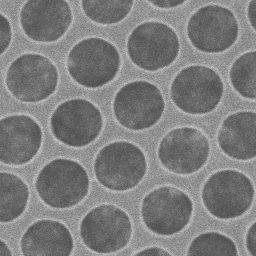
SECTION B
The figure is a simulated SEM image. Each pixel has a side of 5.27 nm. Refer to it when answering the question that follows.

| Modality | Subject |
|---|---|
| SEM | a regular array of holes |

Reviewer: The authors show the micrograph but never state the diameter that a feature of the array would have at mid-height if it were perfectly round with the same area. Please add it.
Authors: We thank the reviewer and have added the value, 264 nanometres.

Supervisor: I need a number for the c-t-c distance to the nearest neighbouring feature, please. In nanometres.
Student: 325